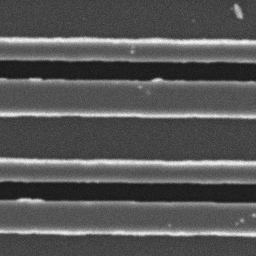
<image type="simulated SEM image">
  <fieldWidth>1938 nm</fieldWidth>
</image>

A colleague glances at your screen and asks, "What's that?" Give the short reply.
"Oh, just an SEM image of lines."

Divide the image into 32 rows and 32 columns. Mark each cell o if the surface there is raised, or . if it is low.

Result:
................................
................................
................................
................................
................................
oooooooooooooooooooooooooooooooo
oooooooooooooooooooooooooooooooo
....o.oooooooooooooooooooooooooo
................................
................................
oooooooooooooooooooooooooooooooo
oooooooooooooooooooooooooooooooo
oooooooooooooooooooooooooooooooo
oooooooooooooooooooooooooooooooo
...............ooooooooooooooooo
................................
................................
................................
................................
................................
oooooooooooooooooooooooooooooooo
oooooooooooooooooooooooooooooooo
oooooooooooooooooooooooooooooooo
................................
................................
oooooooooooooooooooooooooooooooo
oooooooooooooooooooooooooooooooo
oooooooooooooooooooooooooooooooo
oooooooooooooooooooooooooooooooo
................................
................................
................................